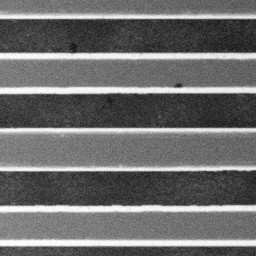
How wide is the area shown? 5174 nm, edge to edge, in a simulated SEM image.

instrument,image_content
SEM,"lines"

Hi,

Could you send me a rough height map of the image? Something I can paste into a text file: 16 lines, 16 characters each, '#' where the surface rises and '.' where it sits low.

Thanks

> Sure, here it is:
################
................
................
............####
################
################
................
................
################
################
################
................
................
################
################
................